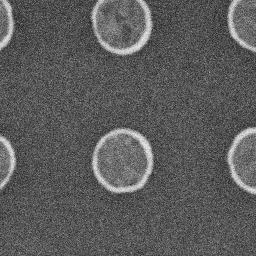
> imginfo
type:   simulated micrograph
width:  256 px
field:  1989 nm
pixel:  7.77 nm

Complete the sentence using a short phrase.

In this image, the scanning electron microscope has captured raised bodies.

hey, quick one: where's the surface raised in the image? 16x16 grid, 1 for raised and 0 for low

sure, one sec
1000001110000001
1000001110000011
0000001110000001
0000000000000000
0000000000000000
0000000000000000
0000000000000000
0000000000000000
0000000110000001
1000001110000011
1000001110000011
0000000110000001
0000000000000000
0000000000000000
0000000000000000
0000000000000000